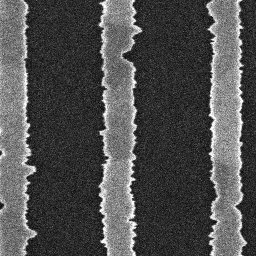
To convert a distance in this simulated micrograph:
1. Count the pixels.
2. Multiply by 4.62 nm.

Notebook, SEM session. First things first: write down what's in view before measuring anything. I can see one or a few lines or trenches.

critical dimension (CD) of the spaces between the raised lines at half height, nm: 358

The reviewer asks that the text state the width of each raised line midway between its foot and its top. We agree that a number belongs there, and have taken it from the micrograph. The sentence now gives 0.134 µm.